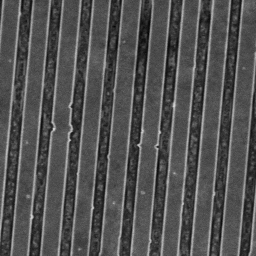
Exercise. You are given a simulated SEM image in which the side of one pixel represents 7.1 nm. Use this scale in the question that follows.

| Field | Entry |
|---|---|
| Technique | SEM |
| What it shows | parallel lines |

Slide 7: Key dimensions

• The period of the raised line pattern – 212 nm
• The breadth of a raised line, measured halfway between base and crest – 0.126 um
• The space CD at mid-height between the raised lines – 12.1 px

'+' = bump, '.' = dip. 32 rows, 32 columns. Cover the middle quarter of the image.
+++...++++...+++++...++++...++++
+++...++++...+++++...++++...++++
+++...++++...+++++...++++...++++
+++...++++...++++...+++++...++++
++...+++++...++++...+++++...++++
++...+++++...++++...+++++...++++
++...+++++...++++...+++++...++++
++...++++....++++...+++++...++++
++...++++....++++...++++....++++
++...++++...+++++...++++...+++++
++...++++...+++++...++++...+++++
++...++++...+++++...++++...+++++
++...++++...+++++...++++...+++++
++...++++...+++++...++++...++++.
++...++++...+++++...++++...++++.
++...++++...++++....++++...++++.
++..+++++...+++++...++++...++++.
++..+++++...++++...+++++...++++.
+...+++++...++++...+++++...++++.
+...+++++...++++...+++++...++++.
+...+++++...++++...++++....++++.
+...++++...+++++...++++....++++.
+...++++...+++++...++++...+++++.
+...++++...+++++...++++...+++++.
+...++++...+++++...++++...+++++.
+...++++...+++++...++++...++++..
+...++++...++++...+++++...++++..
...+++++...++++...+++++...++++..
...+++++...++++...+++++...++++..
...+++++...++++...+++++...++++..
...+++++...++++...+++++...++++..
...+++++...++++...++++....++++..